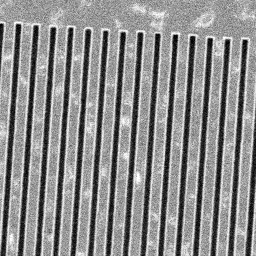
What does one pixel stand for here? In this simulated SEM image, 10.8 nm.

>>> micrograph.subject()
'parallel lines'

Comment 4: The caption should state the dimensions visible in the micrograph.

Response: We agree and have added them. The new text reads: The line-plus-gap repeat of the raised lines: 189 nanometres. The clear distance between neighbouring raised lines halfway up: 63.3 nanometres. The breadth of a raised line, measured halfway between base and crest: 0.127 µm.